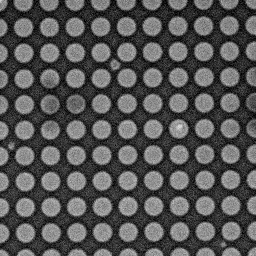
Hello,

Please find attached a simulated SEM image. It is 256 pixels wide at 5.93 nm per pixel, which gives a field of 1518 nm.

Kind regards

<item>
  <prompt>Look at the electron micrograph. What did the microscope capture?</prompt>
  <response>an array of small figures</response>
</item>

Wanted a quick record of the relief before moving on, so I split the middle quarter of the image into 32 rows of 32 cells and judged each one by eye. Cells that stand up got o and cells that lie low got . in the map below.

................................
..oo....oo.....oo....oo....ooo..
.oooo..oooo...oooo..oooo...oooo.
.oooo..oooo...oooo..oooo..ooooo.
.oooo..oooo...oooo..oooo...oooo.
..oo....oo.....oo....oo.....o...
................................
................................
.oooo...ooo...oooo..oooo...ooo..
.oooo..ooooo..oooo..oooo..ooooo.
.oooo..ooooo..oooo..oooo...oooo.
.oooo...ooo...ooo....ooo...ooo..
................................
................................
..oo....oo.....oo....ooo...ooo..
.oooo..oooo...oooo..oooo...oooo.
.oooo..ooooo..oooo..oooo..ooooo.
.oooo..oooo...oooo..oooo...oooo.
..oo.....o......................
................................
............................o...
.oooo...ooo...oooo..oooo...oooo.
.oooo..ooooo..oooo..ooooo..oooo.
.oooo..ooooo..oooo..oooo...oooo.
.oooo...ooo...ooo....ooo...ooo..
................................
................................
..oo....ooo...ooo....ooo...ooo..
.oooo..ooooo..oooo..ooooo..oooo.
.oooo..ooooo..oooo..ooooo..oooo.
.oooo...ooo...oooo...ooo...oooo.
................................